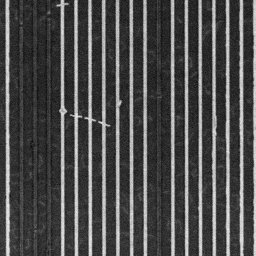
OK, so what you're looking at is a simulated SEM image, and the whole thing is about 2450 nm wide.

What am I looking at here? parallel lines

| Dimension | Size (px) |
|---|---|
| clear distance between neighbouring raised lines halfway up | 11.5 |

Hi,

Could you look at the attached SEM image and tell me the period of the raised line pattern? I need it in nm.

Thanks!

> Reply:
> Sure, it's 132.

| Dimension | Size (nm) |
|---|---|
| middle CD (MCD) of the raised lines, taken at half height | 15.6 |